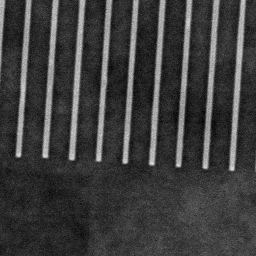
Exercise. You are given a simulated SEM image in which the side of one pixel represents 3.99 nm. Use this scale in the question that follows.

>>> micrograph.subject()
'parallel lines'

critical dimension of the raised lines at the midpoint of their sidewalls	18.4	nm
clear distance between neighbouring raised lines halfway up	87	nm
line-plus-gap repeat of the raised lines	0.107	micrometres